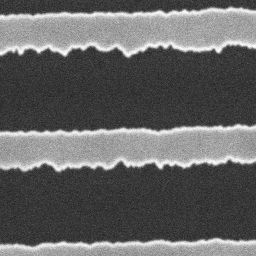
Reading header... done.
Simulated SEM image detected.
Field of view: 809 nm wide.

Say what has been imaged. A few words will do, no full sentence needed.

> lines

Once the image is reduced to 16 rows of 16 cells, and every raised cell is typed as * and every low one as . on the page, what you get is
................
****************
****************
................
................
................
................
................
****************
****************
**.*............
................
................
................
................
****************